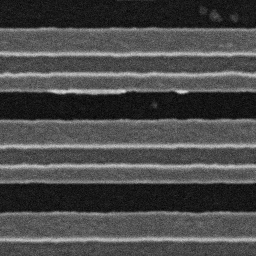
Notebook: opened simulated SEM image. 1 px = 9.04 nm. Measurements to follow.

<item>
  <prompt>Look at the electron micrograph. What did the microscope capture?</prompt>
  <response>lines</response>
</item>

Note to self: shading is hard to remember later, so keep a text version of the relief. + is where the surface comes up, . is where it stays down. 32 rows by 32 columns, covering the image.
................................
................................
................................
................................
++++++++++++++++++++++++++++++++
++++++++++++++++++++++++++++++++
++++++++++++++++++++++++++++++++
++++++++++++++++++++++++++++++++
++++++++++++++++++++++++++++++++
++++++++++++++++++++++++++++++++
++++++++++++++++++++++++++++++++
......++++++++++......++........
................................
................................
................................
++++++++++++++++++++++++++++++++
++++++++++++++++++++++++++++++++
++++++++++++++++++++++++++++++++
++++++++++++++++++++++++++++++++
++++++++++++++++++++++++++++++++
++++++++++++++++++++++++++++++++
++++++++++++++++++++++++++++++++
++++++++++++++++++++++++++++++++
................................
................................
................................
................................
++++++++++++++++++++++++++++++++
++++++++++++++++++++++++++++++++
++++++++++++++++++++++++++++++++
++++++++++++++++++++++++++++++++
++++++++++++++++++++++++++++++++